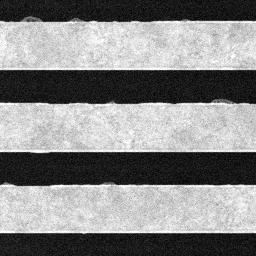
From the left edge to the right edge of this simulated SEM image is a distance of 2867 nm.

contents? lines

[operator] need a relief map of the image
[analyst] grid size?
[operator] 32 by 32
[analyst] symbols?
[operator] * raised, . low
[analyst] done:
................................
................................
................................
********************************
********************************
********************************
********************************
********************************
********************************
................................
................................
................................
................................
********************************
********************************
********************************
********************************
********************************
********************************
................................
................................
................................
................................
********************************
********************************
********************************
********************************
********************************
********************************
................................
................................
................................